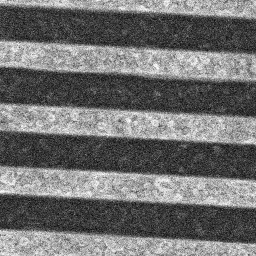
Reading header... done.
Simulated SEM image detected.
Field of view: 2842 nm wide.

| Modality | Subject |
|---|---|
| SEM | one or a few lines or trenches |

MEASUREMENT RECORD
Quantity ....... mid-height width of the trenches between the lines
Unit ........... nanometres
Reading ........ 405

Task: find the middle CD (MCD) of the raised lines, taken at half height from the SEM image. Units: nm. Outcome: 291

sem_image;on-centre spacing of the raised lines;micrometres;0.699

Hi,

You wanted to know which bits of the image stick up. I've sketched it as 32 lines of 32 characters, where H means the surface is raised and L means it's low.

HHHHHHHHHHHHHHHHHHHHHHHHHHHHHHHH
LLLLLLLLLLLLLLLLLLLHHHHHHHHHHHHH
LLLLLLLLLLLLLLLLLLLLLLLLLLLLLLLL
LLLLLLLLLLLLLLLLLLLLLLLLLLLLLLLL
LLLLLLLLLLLLLLLLLLLLLLLLLLLLLLLL
HHHHHHHLLLLLLLLLLLLLLLLLLLLLLLLL
HHHHHHHHHHHHHHHHHHHHHHHHHLLLLLLL
HHHHHHHHHHHHHHHHHHHHHHHHHHHHHHHH
LLLHHHHHHHHHHHHHHHHHHHHHHHHHHHHH
LLLLLLLLLLLLLLLLLLLLLHHHHHHHHHHH
LLLLLLLLLLLLLLLLLLLLLLLLLLLLLLLL
LLLLLLLLLLLLLLLLLLLLLLLLLLLLLLLL
LLLLLLLLLLLLLLLLLLLLLLLLLLLLLLLL
HHHHHHHHLLLLLLLLLLLLLLLLLLLLLLLL
HHHHHHHHHHHHHHHHHHHHHHHHHHLLLLLL
HHHHHHHHHHHHHHHHHHHHHHHHHHHHHHHH
LLLLLLHHHHHHHHHHHHHHHHHHHHHHHHHH
LLLLLLLLLLLLLLLLLLLLLLLLHHHHHHHH
LLLLLLLLLLLLLLLLLLLLLLLLLLLLLLLL
LLLLLLLLLLLLLLLLLLLLLLLLLLLLLLLL
LLLLLLLLLLLLLLLLLLLLLLLLLLLLLLLL
HHHHHHHHHHLLLLLLLLLLLLLLLLLLLLLL
HHHHHHHHHHHHHHHHHHHHHHHHHHHHHLLL
HHHHHHHHHHHHHHHHHHHHHHHHHHHHHHHH
LLLLLLLHHHHHHHHHHHHHHHHHHHHHHHHH
LLLLLLLLLLLLLLLLLLLLLLLLLHHHHHHH
LLLLLLLLLLLLLLLLLLLLLLLLLLLLLLLL
LLLLLLLLLLLLLLLLLLLLLLLLLLLLLLLL
LLLLLLLLLLLLLLLLLLLLLLLLLLLLLLLL
HHHHHHHHHHHHHLLLLLLLLLLLLLLLLLLL
HHHHHHHHHHHHHHHHHHHHHHHHHHHHHHHL
HHHHHHHHHHHHHHHHHHHHHHHHHHHHHHHH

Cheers